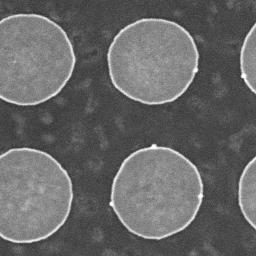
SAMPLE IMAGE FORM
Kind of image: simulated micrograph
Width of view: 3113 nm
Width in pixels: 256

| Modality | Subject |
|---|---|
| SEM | raised bodies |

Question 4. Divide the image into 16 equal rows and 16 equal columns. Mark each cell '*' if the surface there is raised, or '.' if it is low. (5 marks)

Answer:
................
***.....***.....
****...*****...*
*****..*****...*
****...*****...*
****...*****....
.*.......*......
................
................
***......**.....
****....****...*
****...******..*
****...******..*
****...*****...*
***.....***.....
................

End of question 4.